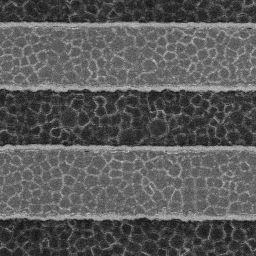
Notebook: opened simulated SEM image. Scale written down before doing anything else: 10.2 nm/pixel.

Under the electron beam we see one or a few lines or trenches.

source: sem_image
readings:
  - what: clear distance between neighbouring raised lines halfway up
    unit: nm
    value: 603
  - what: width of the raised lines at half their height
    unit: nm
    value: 670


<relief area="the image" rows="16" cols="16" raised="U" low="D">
DDDDDDDDDDDDDDDD
DDDDDDDDDDDDDDDD
UUUUUUUUUUUUUUUU
UUUUUUUUUUUUUUUU
UUUUUUUUUUUUUUUU
DUDUUUUDUUUUUUUU
DDDDDDDDDDDDDDDD
DDDDDDDDDDDDDDDD
DDDDDDDDDDDDDDDD
UUUUUUUUUUUUUUUU
UUUUUUUUUUUUUUUU
UUUUUUUUUUUUUUUU
UUUUUUUUUUUUUUUU
UUUUUUUUUUUUUUUU
DDDDDDDDDDDDDDDD
DDDDDDDDDDDDDDDD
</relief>